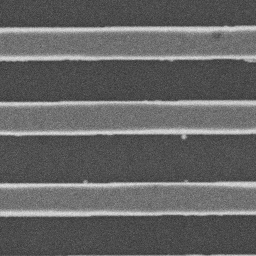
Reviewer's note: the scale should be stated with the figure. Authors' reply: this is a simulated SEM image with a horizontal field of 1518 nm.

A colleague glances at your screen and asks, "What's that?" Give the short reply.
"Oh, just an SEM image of lines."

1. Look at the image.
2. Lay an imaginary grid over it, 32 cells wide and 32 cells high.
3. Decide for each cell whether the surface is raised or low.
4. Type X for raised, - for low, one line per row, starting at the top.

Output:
--------------------------------
--------------------------------
--------------------------------
--------XXXXXXXXXXXXXXXXXXXXXXXX
XXXXXXXXXXXXXXXXXXXXXXXXXXXXXXXX
XXXXXXXXXXXXXXXXXXXXXXXXXXXXXXXX
XXXXXXXXXXXXXXXXXXXXXXXXXXXXXXXX
XXXXXX--------------------------
--------------------------------
--------------------------------
--------------------------------
--------------------------------
--------------------------------
XXXXXXXXXXXXXXXXXXXXXXXXXXXXXXXX
XXXXXXXXXXXXXXXXXXXXXXXXXXXXXXXX
XXXXXXXXXXXXXXXXXXXXXXXXXXXXXXXX
XXXXXXXXXXXXXXXXXXXXXXXXXXXXXXXX
--------------------------------
--------------------------------
--------------------------------
--------------------------------
--------------------------------
--------------------------------
XXXXXXXXXXXXXXXXXXXXXXXXXXXXXXXX
XXXXXXXXXXXXXXXXXXXXXXXXXXXXXXXX
XXXXXXXXXXXXXXXXXXXXXXXXXXXXXXXX
XXXXXXXXXXXXXXXXXXXXXXXXXXXXXXXX
--------------------------------
--------------------------------
--------------------------------
--------------------------------
--------------------------------